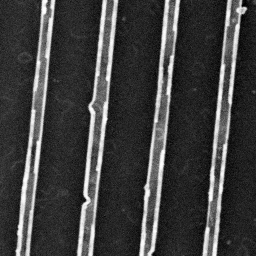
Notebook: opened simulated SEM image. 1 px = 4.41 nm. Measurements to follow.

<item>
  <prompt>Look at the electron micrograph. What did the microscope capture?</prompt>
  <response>one or a few lines or trenches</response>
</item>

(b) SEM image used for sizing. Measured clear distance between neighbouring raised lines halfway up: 0.216 micrometres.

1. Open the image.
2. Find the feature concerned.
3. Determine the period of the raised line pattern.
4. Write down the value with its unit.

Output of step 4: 272 nm